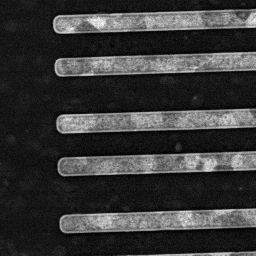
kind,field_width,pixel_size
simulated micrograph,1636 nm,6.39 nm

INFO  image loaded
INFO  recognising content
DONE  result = parallel lines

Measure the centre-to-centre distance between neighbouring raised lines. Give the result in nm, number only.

318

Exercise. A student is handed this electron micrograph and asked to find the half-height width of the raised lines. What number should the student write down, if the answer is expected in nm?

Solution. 108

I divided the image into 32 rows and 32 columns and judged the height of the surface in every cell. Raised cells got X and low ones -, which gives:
--------------------------------
------------------------XXXXXXXX
-------XXXXXXXXXXXXXXXXXXXXXXXXX
-------XXXXXXXXXXXXXXXXXXXX-----
--------------------------------
--------------------------------
--------------------------------
-------XXXXXXXXXXXXXXXXXXXXXXXXX
-------XXXXXXXXXXXXXXXXXXXXXXXXX
--------------------------------
--------------------------------
--------------------------------
--------------------------------
--------------------------------
--------XXXXXXXXXXXXXXXXXXXXXXXX
-------XXXXXXXXXXXXXXXXXXXXXXXXX
--------------------------------
--------------------------------
--------------------------------
-------------------XXXXXXXXXXXXX
-------XXXXXXXXXXXXXXXXXXXXXXXXX
--------XXXXXXXXXXX-------------
--------------------------------
--------------------------------
--------------------------------
--------------------------------
-----------------------XXXXXXXXX
--------XXXXXXXXXXXXXXXXXXXXXXXX
--------XXXXXXXXXXXXXXX---------
--------------------------------
--------------------------------
--------------------------------